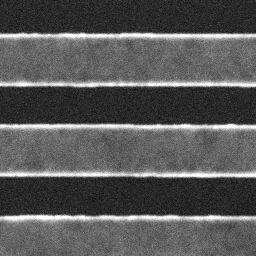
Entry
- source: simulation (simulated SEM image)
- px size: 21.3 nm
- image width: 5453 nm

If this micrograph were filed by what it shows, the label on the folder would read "lines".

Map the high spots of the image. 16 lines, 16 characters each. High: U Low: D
DDDDDDDDDDDDDDDD
DDDDDDDDDDDDDDDD
UUUUUUUUUUUUUUUU
UUUUUUUUUUUUUUUU
UUUUUUUUUUUUUUUU
DDDDDDDDDDDDDDDD
DDDDDDDDDDDDDDDD
DDDDDDDDDDDDDDDD
UUUUUUUUUUUUUUUU
UUUUUUUUUUUUUUUU
UUUUUUUUUUUUUUUU
DDDDDDDDDDDDDDDD
DDDDDDDDDDDDDDDD
DDDDDDDDDDDDDDDD
UUUUUUUUUUUUUUUU
UUUUUUUUUUUUUUUU